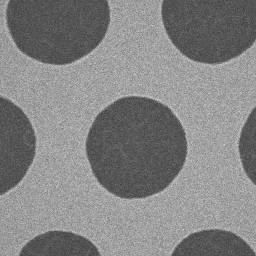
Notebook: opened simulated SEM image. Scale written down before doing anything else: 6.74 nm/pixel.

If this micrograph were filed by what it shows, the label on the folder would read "holes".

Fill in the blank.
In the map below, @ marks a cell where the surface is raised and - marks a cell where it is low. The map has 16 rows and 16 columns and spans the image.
-------@@@------
-------@@@------
@-----@@@@@-----
@@---@@@@@@@---@
@@@@@@@@@@@@@@@@
@@@@@@@@@@@@@@@@
-@@@@@@---@@@@@@
--@@@@-----@@@@-
--@@@-------@@@-
--@@@-------@@@-
--@@@@-----@@@@-
-@@@@@-----@@@@@
@@@@@@@@@@@@@@@@
@@@@@@@@@@@@@@@@
@@@-@@@@@@@@--@@
@-----@@@@@-----